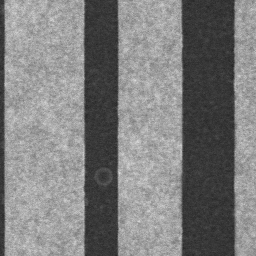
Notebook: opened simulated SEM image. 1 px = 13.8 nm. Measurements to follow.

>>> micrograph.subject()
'one or a few lines or trenches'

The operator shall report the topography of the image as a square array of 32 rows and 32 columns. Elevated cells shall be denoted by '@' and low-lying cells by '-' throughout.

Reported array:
-@@@@@@@@@-----@@@@@@@@------@@@
@@@@@@@@@@-----@@@@@@@@------@@@
-@@@@@@@@@-----@@@@@@@@------@@@
-@@@@@@@@@-----@@@@@@@@------@@@
-@@@@@@@@@-----@@@@@@@@------@@@
-@@@@@@@@@-----@@@@@@@@------@@@
-@@@@@@@@@-----@@@@@@@@------@@@
-@@@@@@@@@-----@@@@@@@@------@@@
-@@@@@@@@@-----@@@@@@@@------@@@
-@@@@@@@@@@@---@@@@@@@@------@@@
-@@@@@@@@@@----@@@@@@@@------@@@
-@@@@@@@@@-----@@@@@@@@------@@@
-@@@@@@@@@-----@@@@@@@@------@@@
-@@@@@@@@@-----@@@@@@@@------@@@
-@@@@@@@@@-----@@@@@@@@------@@@
-@@@@@@@@@-----@@@@@@@@------@@@
-@@@@@@@@@-----@@@@@@@@------@@@
-@@@@@@@@@-----@@@@@@@@------@@@
-@@@@@@@@@-----@@@@@@@@------@@@
-@@@@@@@@@-----@@@@@@@@------@@@
-@@@@@@@@@-----@@@@@@@@-----@@@@
-@@@@@@@@@--@@-@@@@@@@@------@@@
-@@@@@@@@@--@@-@@@@@@@@------@@@
-@@@@@@@@@-----@@@@@@@@------@@@
@@@@@@@@@@-----@@@@@@@@------@@@
-@@@@@@@@@@----@@@@@@@@------@@@
-@@@@@@@@@-----@@@@@@@@------@@@
-@@@@@@@@@-----@@@@@@@@------@@@
-@@@@@@@@@-----@@@@@@@@------@@@
-@@@@@@@@@-----@@@@@@@@------@@@
-@@@@@@@@@-----@@@@@@@@------@@@
-@@@@@@@@@-----@@@@@@@@------@@@